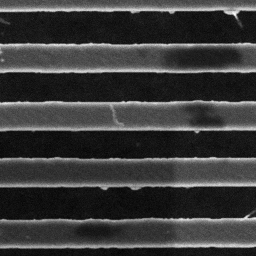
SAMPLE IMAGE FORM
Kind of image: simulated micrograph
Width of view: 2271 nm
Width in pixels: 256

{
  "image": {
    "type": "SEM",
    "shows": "lines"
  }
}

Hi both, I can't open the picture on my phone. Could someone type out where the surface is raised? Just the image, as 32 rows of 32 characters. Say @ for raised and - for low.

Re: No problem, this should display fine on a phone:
@@@@@@@@@@@@@@@@@@@@@@@@@@@@@@@@
----------------------------@@--
--------------------------------
--------------------------------
--------------------------------
-----------@-----------------@@@
@@@@@@@@@@@@@@@@@@@@@@@@@@@@@@@@
@@@@@@@@@@@@@@@@@@@@@@@@@@@@@@@@
@@@@@@@@@@@@@@@@@@@@@@@@@@@@@@@@
--------------------------------
--------------------------------
--------------------------------
--------------------------------
@@@@@@@@@@@@@@@@@@@@@@@@@@@@@@@@
@@@@@@@@@@@@@@@@@@@@@@@@@@@@@@@@
@@@@@@@@@@@@@@@@@@@@@@@@@@@@@@@@
--------------------------------
--------------------------------
--------------------------------
--------------------------------
@@@@@@@@@@@@@@@@@@@@@@@@@@@@@@@@
@@@@@@@@@@@@@@@@@@@@@@@@@@@@@@@@
@@@@@@@@@@@@@@@@@@@@@@@@@@@@@@@@
--------------------------------
--------------------------------
--------------------------------
--------------------------------
@----@@@@-@@@@-@@@@@@@@@@@@@@@@@
@@@@@@@@@@@@@@@@@@@@@@@@@@@@@@@@
@@@@@@@@@@@@@@@@@@@@@@@@@@@@@@@@
@@@@@@@@@@@@@@@@@@@@@@@@@@@@@@@@
--------------------------------